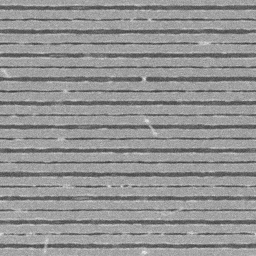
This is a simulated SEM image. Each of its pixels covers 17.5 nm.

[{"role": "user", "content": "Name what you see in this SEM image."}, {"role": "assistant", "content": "parallel lines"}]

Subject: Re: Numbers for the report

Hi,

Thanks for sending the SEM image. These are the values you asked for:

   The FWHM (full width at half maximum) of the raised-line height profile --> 151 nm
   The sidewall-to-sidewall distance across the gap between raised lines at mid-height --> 0.0745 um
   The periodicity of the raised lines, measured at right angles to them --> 207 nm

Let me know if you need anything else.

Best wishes